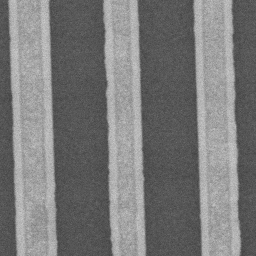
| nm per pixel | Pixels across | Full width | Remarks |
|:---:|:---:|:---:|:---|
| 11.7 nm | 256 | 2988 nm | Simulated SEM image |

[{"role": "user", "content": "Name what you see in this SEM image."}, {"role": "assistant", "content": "one or a few lines or trenches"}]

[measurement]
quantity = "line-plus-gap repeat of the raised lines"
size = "1.07 µm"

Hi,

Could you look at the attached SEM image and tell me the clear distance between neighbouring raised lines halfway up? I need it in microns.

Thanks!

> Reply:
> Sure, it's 0.75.